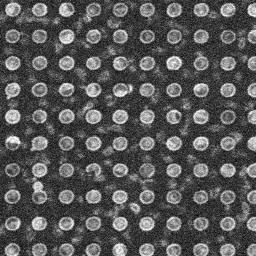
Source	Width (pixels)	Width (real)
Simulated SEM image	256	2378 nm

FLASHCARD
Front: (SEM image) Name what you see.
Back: a regular array of raised bodies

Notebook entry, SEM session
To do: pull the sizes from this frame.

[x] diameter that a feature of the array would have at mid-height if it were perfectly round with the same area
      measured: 122 nanometers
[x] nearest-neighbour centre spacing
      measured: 246 nm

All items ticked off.